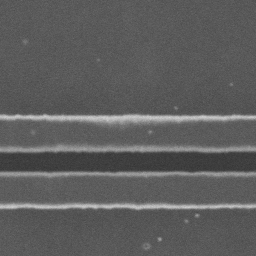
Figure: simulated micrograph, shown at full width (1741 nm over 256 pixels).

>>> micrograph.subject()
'lines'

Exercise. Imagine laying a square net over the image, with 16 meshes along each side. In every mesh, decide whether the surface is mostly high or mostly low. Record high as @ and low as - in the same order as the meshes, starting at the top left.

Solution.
----------------
----------------
----------------
----------------
----------------
----------------
----------------
@@@@@@@@@@@@@@@@
@@@@@@@@@@@@@@@@
@@@---------@@--
----------------
@@@@@@@@@@@@@@@@
@@@@@@@@@@@@@@@@
----------------
----------------
----------------